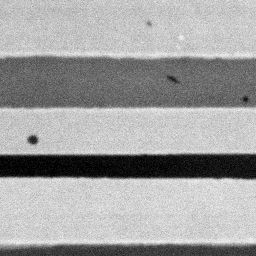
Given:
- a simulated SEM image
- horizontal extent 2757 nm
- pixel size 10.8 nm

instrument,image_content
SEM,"lines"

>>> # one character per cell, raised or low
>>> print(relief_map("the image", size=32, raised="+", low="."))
++++++++++++++++++++++++++++++++
++++++++++++++++++++++++++++++++
++++++++++++++++++++++++++++++++
++++++++++++++++++++++++++++++++
++++++++++++++++++++++++++++++++
++++++++++++++++++++++++++++++++
++++++++++++++++++++++++++++++++
................................
................................
................................
................................
................................
................................
................................
++++++++++++++++++++++++++++++++
++++++++++++++++++++++++++++++++
++++++++++++++++++++++++++++++++
++++++++++++++++++++++++++++++++
++++++++++++++++++++++++++++++++
................................
................................
................................
+++++++++++++++++++++++++++++++.
++++++++++++++++++++++++++++++++
++++++++++++++++++++++++++++++++
++++++++++++++++++++++++++++++++
++++++++++++++++++++++++++++++++
++++++++++++++++++++++++++++++++
++++++++++++++++++++++++++++++++
++++++++++++++++++++++++++++++++
++++............................
................................